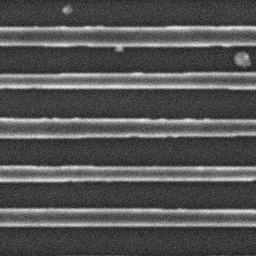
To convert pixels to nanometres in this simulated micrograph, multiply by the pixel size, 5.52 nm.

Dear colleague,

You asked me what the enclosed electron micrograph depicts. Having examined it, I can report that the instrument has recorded lines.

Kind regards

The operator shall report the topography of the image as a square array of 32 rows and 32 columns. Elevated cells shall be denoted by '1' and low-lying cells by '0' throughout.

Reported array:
00000000000000000000000000000000
00000000000000000000000000000000
00000000000000000000000000000000
11111111111111111111111111111111
11111111111111111111111111111111
11111111111111111111111111111111
00000000000000000000000000000000
00000000000000000000000000000000
00000000000000000000000000000000
11111111111111111111111111111111
11111111111111111111111111111111
00000000000000000000000000000000
00000000000000000000000000000000
00000000000000000000000000000000
00000000000000000000000000000000
11111111111111111111111111111111
11111111111111111111111111111111
00000000000000000000000000000000
00000000000000000000000000000000
00000000000000000000000000000000
00000000000000000000000000000000
11111111111111111111111111111111
11111111111111111111111111111111
00000000000000000000000000000000
00000000000000000000000000000000
00000000000000000000000000000000
11111111111111111111111111111111
11111111111111111111111111111111
00000000000000000000000000000000
00000000000000000000000000000000
00000000000000000000000000000000
00000000000000000000000000000000